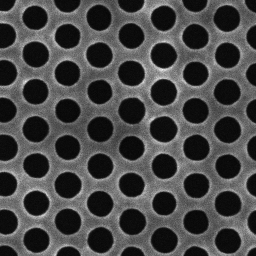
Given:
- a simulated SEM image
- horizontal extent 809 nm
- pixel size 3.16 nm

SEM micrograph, a regular array of holes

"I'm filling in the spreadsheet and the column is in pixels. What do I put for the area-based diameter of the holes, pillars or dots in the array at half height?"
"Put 25.4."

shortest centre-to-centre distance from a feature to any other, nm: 116